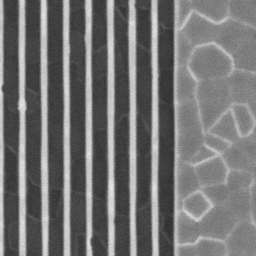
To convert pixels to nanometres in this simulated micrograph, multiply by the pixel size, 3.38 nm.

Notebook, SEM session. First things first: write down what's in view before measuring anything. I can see parallel lines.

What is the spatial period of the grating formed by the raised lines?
75 nanometers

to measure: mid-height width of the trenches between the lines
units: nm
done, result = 57.5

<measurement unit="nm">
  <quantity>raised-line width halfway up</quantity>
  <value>17.3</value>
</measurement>